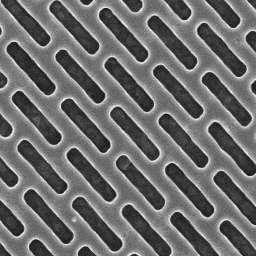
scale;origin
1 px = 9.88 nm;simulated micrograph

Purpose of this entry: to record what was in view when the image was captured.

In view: a regular array of holes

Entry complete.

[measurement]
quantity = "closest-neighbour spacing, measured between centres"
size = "486 nm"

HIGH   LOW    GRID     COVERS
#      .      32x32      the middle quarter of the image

....######.....########..#####..
.....######....#######....#####.
#.....######....######.....#####
##.....#####.....######.....####
###.....#####.....######.....###
####.....#####.....######.....##
#####....######.....######.....#
######....######.....######.....
######....#######.....#####.....
...####..#########....######....
....###############...#######...
....########...#####..########..
.....#######....#########.#####.
#.....######.....#######...#####
##.....######.....#####.....####
###.....######....######.....###
####.....######....######.....##
#####.....######....######.....#
######.....#####.....######.....
#######.....#####.....######....
########....######.....######...
#...#####..########.....######..
#....###############....#######.
#.....########..#####..########.
#.....#######....###############
##.....######.....########..####
###.....######.....######....###
####.....######.....#####.....##
#####.....######.....#####.....#
######.....#####.....######.....
.######.....#####.....######....
########.....#####.....######...